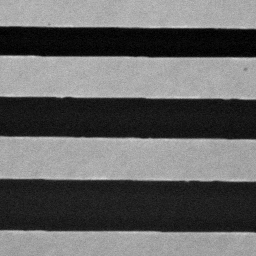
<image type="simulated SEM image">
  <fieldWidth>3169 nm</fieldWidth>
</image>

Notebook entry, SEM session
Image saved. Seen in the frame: lines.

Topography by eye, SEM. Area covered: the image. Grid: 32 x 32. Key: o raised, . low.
oooooooooooooooooooooooooooooooo
oooooooooooooooooooooooooooooooo
oooooooooooooooooooooooooooooooo
............................oooo
................................
................................
................................
oooooooooooooooooooooooooooooooo
oooooooooooooooooooooooooooooooo
oooooooooooooooooooooooooooooooo
oooooooooooooooooooooooooooooooo
oooooooooooooooooooooooooooooooo
................................
................................
................................
................................
................................
ooooooooooooooooooooooooooo.....
oooooooooooooooooooooooooooooooo
oooooooooooooooooooooooooooooooo
oooooooooooooooooooooooooooooooo
oooooooooooooooooooooooooooooooo
...................ooooooooooooo
................................
................................
................................
................................
................................
................................
oooooooooooooooooooooooooooooooo
oooooooooooooooooooooooooooooooo
oooooooooooooooooooooooooooooooo